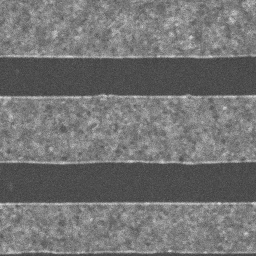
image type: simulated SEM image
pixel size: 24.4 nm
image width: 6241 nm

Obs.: one or a few lines or trenches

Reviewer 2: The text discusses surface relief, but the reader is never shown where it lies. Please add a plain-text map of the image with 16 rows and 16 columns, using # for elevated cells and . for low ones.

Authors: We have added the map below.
################
################
################
...############.
................
................
################
################
################
################
................
................
................
################
################
################